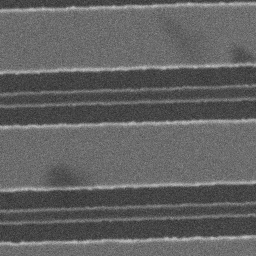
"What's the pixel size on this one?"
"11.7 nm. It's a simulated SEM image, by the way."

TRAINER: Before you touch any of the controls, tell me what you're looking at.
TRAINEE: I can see lines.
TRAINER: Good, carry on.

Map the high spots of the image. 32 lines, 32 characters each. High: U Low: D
DDDDDDDDDDDDDDDDDDDDDDUUUUUUUUUU
UUUUUUUUUUUUUUUUUUUUUUUUUUUUUUUU
UUUUUUUUUUUUUUUUUUUUUUUUUUUUUUUU
UUUUUUUUUUUUUUUUUUUUUUUUUUUUUUUU
UUUUUUUUUUUUUUUUUUUUUUUUUUUUUUUU
UUUUUUUUUUUUUUUUUUUUUUUUUUUUUUUU
UUUUUUUUUUUUUUUUUUUUUUUUUUUUUUUU
UUUUUUUUUUUUUUUUUUUUUUUUUUUUUUUU
UUUUUUUUUUUUUUUUUUUDUDDDDDDDDDDD
DDDDDDDDDDDDDDDDDDDDDDDDDDDDDDDD
DDDDDDDDDDDDDDDDDDDDDDDDDDDDDDDD
DDDDDUUUUUUUUUUUUUUUUUUUUUUUUUUU
UUUUUUUUUUUUUUUUUUUUUUUUUUUUUUUD
DDDDDDDDDDDDDDDDDDDDDDDDDDDDDDDD
DDDDDDDDDDDDDDDDDDDDDDDDDDDDDDDD
DDDDDDDDDDDDUUUUUUUUUUUUUUUUUUUU
UUUUUUUUUUUUUUUUUUUUUUUUUUUUUUUU
UUUUUUUUUUUUUUUUUUUUUUUUUUUUUUUU
UUUUUUUUUUUUUUUUUUUUUUUUUUUUUUUU
UUUUUUUUUUUUUUUUUUUUUUUUUUUUUUUU
UUUUUUUUUUUUUUUUUUUUUUUUUUUUUUUU
UUUUUUUUUUUUUUUUUUUUUUUUUUUUUUUU
UUUUUUUUUUUUUUUUUUUUUUUUUUUUUUUU
UUUUUUUUUUUUUUUDDDDDDDDDDDDDDDDD
DDDDDDDDDDDDDDDDDDDDDDDDDDDDDDDD
DDDDDDDDDDDDDDDDDDDDDDDDDDUUUUUU
UUUUUUUUUUUUUUUUUUUUUUUUUUUUUUUU
UUUUUUUUUUUUUUDUDDDDDDDDDDDDDDDD
DDDDDDDDDDDDDDDDDDDDDDDDDDDDDDDD
DDDDDDDDDDDDDDDDDDDDDDDDDDDDDDDD
UUUUUUUUUUUUUUUUUUUUUUUUUUUUUUUU
UUUUUUUUUUUUUUUUUUUUUUUUUUUUUUUU